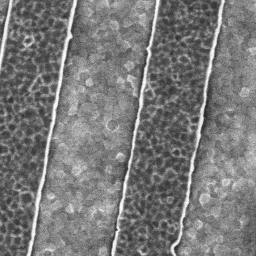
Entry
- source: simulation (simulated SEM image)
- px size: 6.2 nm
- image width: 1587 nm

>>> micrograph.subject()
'one or a few lines or trenches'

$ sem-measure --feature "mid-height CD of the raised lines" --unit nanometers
390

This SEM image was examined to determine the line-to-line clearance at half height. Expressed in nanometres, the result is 512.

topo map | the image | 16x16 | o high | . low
.oooo.....oooo..
oooo......oooo..
oooo.....oooo...
oooo.....oooo...
oooo.....oooo...
oooo.....oooo...
ooo......oooo...
ooo......oooo...
ooo.....oooo....
ooo.....oooo....
ooo.....oooo....
ooo.....oooo....
oo......oooo....
oo.....oooo.....
oo.....oooo.....
oo.....oooo.....